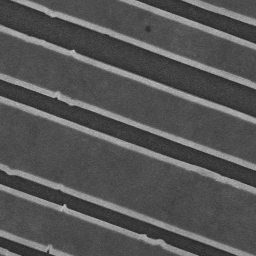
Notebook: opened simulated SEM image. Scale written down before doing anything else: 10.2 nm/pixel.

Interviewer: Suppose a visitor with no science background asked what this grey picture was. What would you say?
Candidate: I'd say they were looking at one or a few lines or trenches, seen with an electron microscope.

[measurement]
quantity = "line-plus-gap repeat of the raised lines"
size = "759 nm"